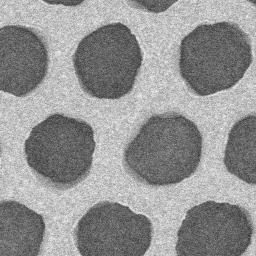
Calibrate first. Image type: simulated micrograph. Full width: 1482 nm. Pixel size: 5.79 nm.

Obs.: holes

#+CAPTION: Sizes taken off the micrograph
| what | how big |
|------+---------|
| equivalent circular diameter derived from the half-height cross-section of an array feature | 417 nm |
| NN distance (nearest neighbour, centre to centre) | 588 nanometres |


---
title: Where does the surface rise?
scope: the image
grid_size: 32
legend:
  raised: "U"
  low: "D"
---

UUUUUUDDDDUUUUUUUDDDDDUUUUUUUUUU
UUUUUUUUUUUUUUUUUUDDUUUUUUUUUUUU
UUUUUUUUUUUUUUUUUUUUUUUUUUUUUUUU
DDDUUUUUUUUUDDDDUUUUUUUUUDDDDDUU
DDDDDUUUUUUDDDDDDUUUUUUDDDDDDDDU
DDDDDDUUUUDDDDDDDUUUUUDDDDDDDDDU
DDDDDDUUUDDDDDDDDDUUUUDDDDDDDDDU
DDDDDDUUUDDDDDDDDDUUUUDDDDDDDDDU
DDDDDDUUUDDDDDDDDUUUUUUDDDDDDDDU
DDDDDDUUUUDDDDDDDUUUUUUDDDDDDDUU
DDDDDUUUUUDDDDDDDUUUUUUUDDDDDUUU
DDDDUUUUUUUDDDDDUUUUUUUUDDDUUUUU
UUUUUUUUUUUUUUUUUUUUUUUUUUUUUUUU
UUUUUUUUUUUUUUUUUUUUUUUUUUUUUUUU
UUUUUUDDUUUUUUUUUUUDDDDUUUUUUUUD
UUUUUDDDDDDUUUUUUUDDDDDDUUUUUDDD
UUUUDDDDDDDDUUUUUDDDDDDDDUUUUDDD
UUUDDDDDDDDDUUUUDDDDDDDDDUUUDDDD
UUUDDDDDDDDDUUUUDDDDDDDDDUUUDDDD
UUUDDDDDDDDDUUUDDDDDDDDDDUUUDDDD
UUUUDDDDDDDDUUUUDDDDDDDDDUUUDDDD
UUUUUDDDDDDUUUUUDDDDDDDDUUUUUDDD
UUUUUUDDDDUUUUUUUDDDDDDUUUUUUUDD
UUUUUUUUUUUUUUUUUUUUUUUUUUUUUUUU
UUUUUUUUUUUUUUUUUUUUUUUUUUUUUUUU
DDDUUUUUUUUUDDDUUUUUUUUUUDDDDUUU
DDDDUUUUUUUDDDDDDUUUUUUDDDDDDDDU
DDDDDUUUUUDDDDDDDDDUUUUDDDDDDDDU
DDDDDDUUUUDDDDDDDDDUUUDDDDDDDDDD
DDDDDUUUUUDDDDDDDDDUUUDDDDDDDDDU
DDDDDUUUUUDDDDDDDDDUUUDDDDDDDDDU
DDDDDUUUUUDDDDDDDDUUUUDDDDDDDDDU